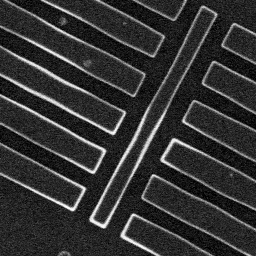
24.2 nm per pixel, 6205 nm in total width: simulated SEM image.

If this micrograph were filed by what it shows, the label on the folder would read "groups of lines, slits or small figures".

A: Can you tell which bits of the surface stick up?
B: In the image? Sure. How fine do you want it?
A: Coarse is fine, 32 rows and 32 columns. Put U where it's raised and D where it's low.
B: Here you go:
UUDDDDUUUUUUUDDDDDUUUUUDDDDDDDDD
UUUUDDDDUUUUUUUDDDDUUUDDDUUDDDDD
UUUUUDDDDDUUUUUUUDDDDDDDUUUDDDDD
UUUUUUUDDDDDUUUUUUUDDDDDUUDDDUUD
DDUUUUUUUDDDDDUUUUUUDDDUUUDDUUUU
DDDDUUUUUUUDDDDDUUUUDDDUUDDDUUUU
UDDDDDUUUUUUUDDDDDUUDDUUUDDDDUUU
UUUDDDDDUUUUUUUDDDDDDDUUDDDDDDDU
UUUUUDDDDDUUUUUUUDDDDUUUDDUUDDDD
UUUUUUUDDDDDUUUUUUDDDUUDDDUUUUDD
DDUUUUUUUDDDDDUUUUDDUUDDDDUUUUUU
DDDDUUUUUUUDDDDDUDDDUUDDDDDUUUUU
UDDDDDUUUUUUUDDDDDDUUDDDDDDDDUUU
UUUDDDDDUUUUUUUDDDUUUDDDUUDDDDDU
UUUUUDDDDDUUUUUDDDUUDDDUUUUUDDDD
UUUUUUUDDDDDUUUDDDUUDDDUUUUUUUDD
DDUUUUUUUDDDDDDDDUUDDDDDDUUUUUUU
DDDDUUUUUUDDDDDDDUUDDDDDDDDUUUUU
UDDDDDUUUUUUDDDDUUDDDUUUDDDDDUUU
UUUDDDDDUUUUUDDDUUDDUUUUUUDDDDDU
UUUUUDDDDUUUDDDUUDDDDUUUUUUUDDDD
UUUUUUUDDDDUDDUUUDDDDDDUUUUUUUDD
DDUUUUUUUDDDDDUUDDDUUDDDDUUUUUUU
DDDDUUUUUUDDDUUUDDUUUUDDDDUUUUUU
DDDDDUUUUUDDDUUDDDUUUUUUDDDDUUUU
DDDDDDDUUUDDUUUDDDDUUUUUUUDDDDUU
DDDDDDDDDDDDUUDDDDDDDUUUUUUUDDDD
DDDDDDDDDDDDUUDDUUDDDDDUUUUUUUDD
DDDDDDDDDDDDDDDDUUUUDDDDDUUUUUUU
DDDDDDDDDDDDDDDUUUUUUUDDDDDUUUUU
DDDDDDDDDDDDDDDDDUUUUUUUDDDDUUUU
DDDDDDDDDDDDDDDDDDDUUUUUUUDDDDUU